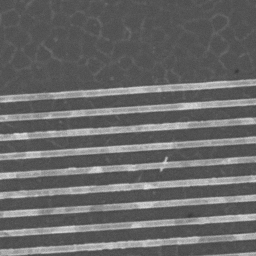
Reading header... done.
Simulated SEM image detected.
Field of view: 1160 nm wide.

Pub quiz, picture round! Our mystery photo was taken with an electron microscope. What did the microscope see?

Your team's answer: parallel lines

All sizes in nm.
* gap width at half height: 61.5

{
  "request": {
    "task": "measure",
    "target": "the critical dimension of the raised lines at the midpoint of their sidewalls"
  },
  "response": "26.5 nm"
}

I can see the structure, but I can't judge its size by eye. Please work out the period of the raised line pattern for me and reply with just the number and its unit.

86.8 nm